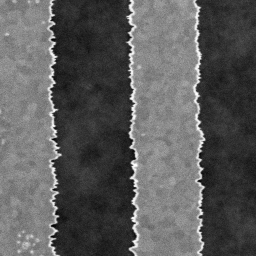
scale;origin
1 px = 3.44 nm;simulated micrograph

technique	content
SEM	one or a few lines or trenches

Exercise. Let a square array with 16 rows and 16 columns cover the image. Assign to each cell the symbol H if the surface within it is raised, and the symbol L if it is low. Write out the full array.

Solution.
HHHLLLLLHHHHLLLL
HHHLLLLLHHHHLLLL
HHHLLLLLHHHHLLLL
HHHLLLLLHHHHLLLL
HHHLLLLLHHHHLLLL
HHHLLLLLHHHHLLLL
HHHLLLLLHHHHLLLL
HHHLLLLLHHHHLLLL
HHHLLLLLHHHHHLLL
HHHHLLLLHHHHLLLL
HHHLLLLLHHHHHLLL
HHHLLLLLHHHHHLLL
HHHLLLLLHHHHHLLL
HHHLLLLLHHHHHLLL
HHHLLLLLHHHHHLLL
HHHLLLLLHHHHHLLL